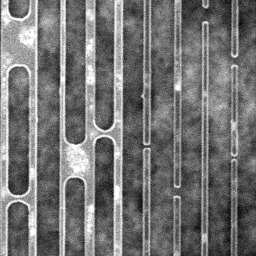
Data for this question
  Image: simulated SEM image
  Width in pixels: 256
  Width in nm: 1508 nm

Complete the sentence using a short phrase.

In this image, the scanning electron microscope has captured parallel lines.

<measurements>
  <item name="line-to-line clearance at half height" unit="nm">132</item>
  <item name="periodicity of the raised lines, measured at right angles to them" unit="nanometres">170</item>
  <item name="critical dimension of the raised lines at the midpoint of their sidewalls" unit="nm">37.6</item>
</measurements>